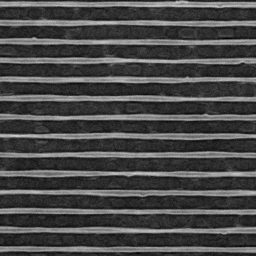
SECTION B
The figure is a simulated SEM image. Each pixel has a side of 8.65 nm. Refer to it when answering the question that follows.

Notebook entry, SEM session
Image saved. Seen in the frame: parallel lines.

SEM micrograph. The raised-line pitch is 163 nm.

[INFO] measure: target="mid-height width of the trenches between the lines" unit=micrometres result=0.121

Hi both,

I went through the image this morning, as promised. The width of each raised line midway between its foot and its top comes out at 0.0379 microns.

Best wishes